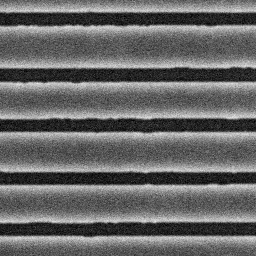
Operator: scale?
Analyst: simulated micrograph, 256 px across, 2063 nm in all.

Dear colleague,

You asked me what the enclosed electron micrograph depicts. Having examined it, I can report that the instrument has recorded lines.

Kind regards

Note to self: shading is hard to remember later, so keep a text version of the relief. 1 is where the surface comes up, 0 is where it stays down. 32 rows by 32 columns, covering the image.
11111111111111111111111111111111
11000000000000000000000000000000
00000000000000000000000000000000
11111111111111111111111111111111
11111111111111111111111111111111
11111111111111111111111111111111
11111111111111111111111111111111
11111111111111111111111111111111
00000000000000000000000000000000
00000000000000000000000000000000
11111111111111111111111111111111
11111111111111111111111111111111
11111111111111111111111111111111
11111111111111111111111111111111
11111111111111111111111111111111
00000000000000000000000000000000
00000000000000000000000000000010
11111111111111111111111111111111
11111111111111111111111111111111
11111111111111111111111111111111
11111111111111111111111111111111
00000000000000000110000000000100
00000000000000000000000000000000
11111111111111111111111111111111
11111111111111111111111111111111
11111111111111111111111111111111
11111111111111111111111111111111
11111111111111111111111111111111
00000000000000000000000000000000
00000000000000000000000000000000
11111111111111111111111111111111
11111111111111111111111111111111